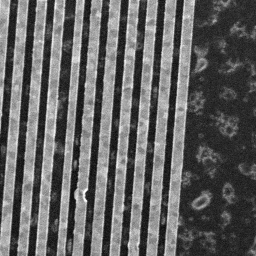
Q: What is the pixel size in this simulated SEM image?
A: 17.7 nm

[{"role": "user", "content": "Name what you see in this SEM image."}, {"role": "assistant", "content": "parallel lines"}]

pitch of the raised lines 18.4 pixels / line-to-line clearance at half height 0.152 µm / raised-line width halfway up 170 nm